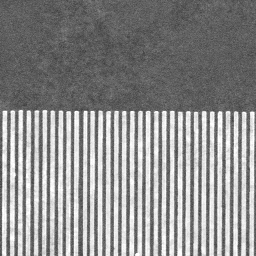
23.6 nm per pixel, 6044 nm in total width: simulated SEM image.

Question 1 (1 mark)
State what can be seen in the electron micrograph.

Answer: parallel lines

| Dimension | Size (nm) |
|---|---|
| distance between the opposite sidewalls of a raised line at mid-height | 79.7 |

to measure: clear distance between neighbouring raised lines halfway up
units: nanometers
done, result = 103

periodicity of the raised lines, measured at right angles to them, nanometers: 188